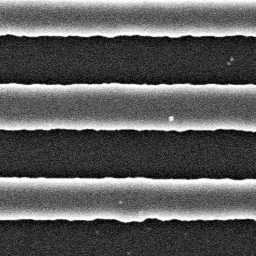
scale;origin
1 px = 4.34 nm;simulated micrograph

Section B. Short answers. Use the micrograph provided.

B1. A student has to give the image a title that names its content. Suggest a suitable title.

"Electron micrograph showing lines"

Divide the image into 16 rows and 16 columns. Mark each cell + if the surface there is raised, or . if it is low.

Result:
++++++++++++++++
++++++++++++++++
................
................
................
++++++++++++++++
++++++++++++++++
++++++++++++++++
................
................
................
++++++++++++++++
++++++++++++++++
++++++++++++++++
................
................